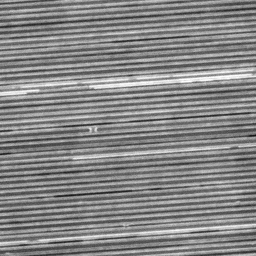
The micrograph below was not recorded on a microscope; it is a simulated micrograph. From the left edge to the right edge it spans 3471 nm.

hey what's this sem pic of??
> parallel lines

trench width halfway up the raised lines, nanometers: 49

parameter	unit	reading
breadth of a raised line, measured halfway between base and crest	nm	37.2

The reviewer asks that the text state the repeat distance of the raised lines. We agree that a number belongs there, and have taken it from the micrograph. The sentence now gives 78.2 nm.